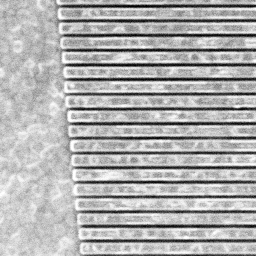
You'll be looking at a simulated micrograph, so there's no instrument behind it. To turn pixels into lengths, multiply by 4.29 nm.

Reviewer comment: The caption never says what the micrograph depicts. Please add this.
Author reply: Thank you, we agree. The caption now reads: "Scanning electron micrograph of parallel lines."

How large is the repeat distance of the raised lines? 62.9 nm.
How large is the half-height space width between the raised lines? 19.9 nm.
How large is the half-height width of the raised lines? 0.044 microns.